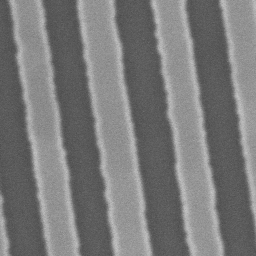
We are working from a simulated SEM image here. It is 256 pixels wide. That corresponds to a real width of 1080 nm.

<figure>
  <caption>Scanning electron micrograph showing lines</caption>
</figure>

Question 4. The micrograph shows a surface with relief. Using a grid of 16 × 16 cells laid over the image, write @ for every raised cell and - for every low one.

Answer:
-@@--@@---@@--@@
-@@--@@---@@--@@
-@@--@@---@@--@@
-@@--@@@--@@--@@
-@@---@@--@@---@
-@@---@@--@@---@
--@@--@@---@---@
--@@--@@---@@--@
--@@--@@---@@--@
--@@--@@---@@--@
--@@--@@@--@@--@
--@@---@@--@@---
--@@---@@--@@---
---@@--@@---@---
---@@--@@---@@--
---@@--@@---@@--